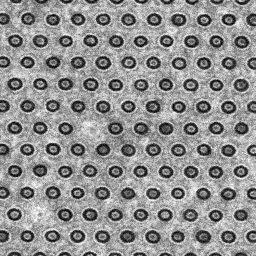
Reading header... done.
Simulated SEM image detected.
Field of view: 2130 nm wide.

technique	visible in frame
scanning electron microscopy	a regular array of ring-shaped grooves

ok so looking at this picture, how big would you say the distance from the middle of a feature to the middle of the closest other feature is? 205 nanometres